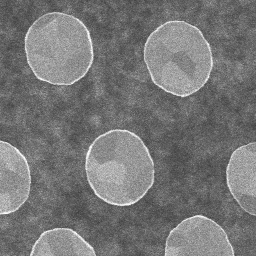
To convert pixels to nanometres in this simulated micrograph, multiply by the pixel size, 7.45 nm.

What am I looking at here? raised bodies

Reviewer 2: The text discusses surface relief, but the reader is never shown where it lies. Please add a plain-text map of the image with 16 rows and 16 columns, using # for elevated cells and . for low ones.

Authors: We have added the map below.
................
..###.....##....
..####...####...
..####...####...
..###....####...
..........##....
................
................
......##........
#.....###......#
##...#####....##
##....###.....##
##.....##......#
................
...##......###..
..####....####..